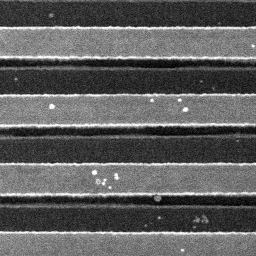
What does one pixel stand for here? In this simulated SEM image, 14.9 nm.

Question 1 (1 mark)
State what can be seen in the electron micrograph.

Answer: lines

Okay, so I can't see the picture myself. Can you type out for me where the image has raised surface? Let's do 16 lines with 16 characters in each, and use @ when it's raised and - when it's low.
----------------
----------------
@@@@@@@@@@@@@@@@
@@@@@@@@@@@@@@@@
----------------
----------------
@@@@@@@@@@@@@@@@
@@@@@@@@@@@@@@@@
----------------
----------------
@@@@@@@@@@@@@@@@
@@@@@@@@@@@@@@@@
----------------
----------------
----------------
@@@@@@@@@@@@@@@@